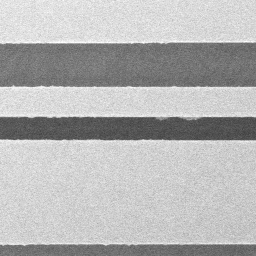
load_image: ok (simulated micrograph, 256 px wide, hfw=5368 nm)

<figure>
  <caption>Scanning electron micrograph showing lines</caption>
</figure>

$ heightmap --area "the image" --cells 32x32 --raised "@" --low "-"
@@@@@@@@@@@@@@@@@@@@@@@@@@@@@@@@
@@@@@@@@@@@@@@@@@@@@@@@@@@@@@@@@
@@@@@@@@@@@@@@@@@@@@@@@@@@@@@@@@
@@@@@@@@@@@@@@@@@@@@@@@@@@@@@@@@
@@@@@@@@@@@@@@@@@@@@@@@@@@@@@@@@
--------------------------------
--------------------------------
--------------------------------
--------------------------------
--------------------------------
--------------------------------
@@@@@@@@@@@@@@@@@@@@@@@@@@@@@@@@
@@@@@@@@@@@@@@@@@@@@@@@@@@@@@@@@
@@@@@@@@@@@@@@@@@@@@@@@@@@@@@@@@
@@@@@@@@@@@@@@@@@@@@@@@@@@@@@@@@
--------------------------------
--------------------------------
--------------------------------
@@@@@@@@@@@@@@@@@@@@@@@@@@@@@@@@
@@@@@@@@@@@@@@@@@@@@@@@@@@@@@@@@
@@@@@@@@@@@@@@@@@@@@@@@@@@@@@@@@
@@@@@@@@@@@@@@@@@@@@@@@@@@@@@@@@
@@@@@@@@@@@@@@@@@@@@@@@@@@@@@@@@
@@@@@@@@@@@@@@@@@@@@@@@@@@@@@@@@
@@@@@@@@@@@@@@@@@@@@@@@@@@@@@@@@
@@@@@@@@@@@@@@@@@@@@@@@@@@@@@@@@
@@@@@@@@@@@@@@@@@@@@@@@@@@@@@@@@
@@@@@@@@@@@@@@@@@@@@@@@@@@@@@@@@
@@@@@@@@@@@@@@@@@@@@@@@@@@@@@@@@
@@@@@@@@@@@@@@@@@@@@@@@@@@@@@@@@
@@@@----------------@-----------
--------------------------------